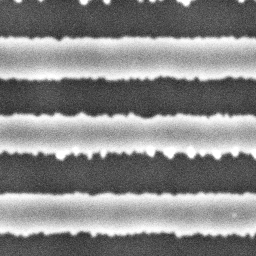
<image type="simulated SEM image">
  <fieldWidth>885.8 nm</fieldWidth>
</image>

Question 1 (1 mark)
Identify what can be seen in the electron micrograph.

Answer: lines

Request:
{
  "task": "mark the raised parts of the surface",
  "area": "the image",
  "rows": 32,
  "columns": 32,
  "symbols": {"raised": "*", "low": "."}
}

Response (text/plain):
................................
................................
................................
................................
................................
********************************
********************************
********************************
********************************
********************.*******.***
................................
................................
................................
................................
..**...*..*.....*.....*.........
********************************
********************************
********************************
********************************
.......*........................
................................
................................
................................
................................
***********.********************
********************************
********************************
********************************
********************************
................................
................................
................................